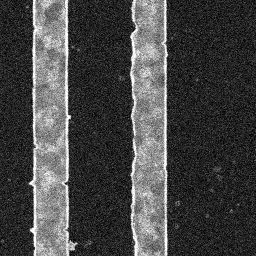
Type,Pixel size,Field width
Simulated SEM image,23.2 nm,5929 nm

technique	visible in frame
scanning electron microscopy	one or a few lines or trenches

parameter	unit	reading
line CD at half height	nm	750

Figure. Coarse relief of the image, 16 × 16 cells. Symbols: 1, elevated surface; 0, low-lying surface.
0011000011000000
0011000011000000
0011000011000000
0011000011000000
0011000011000000
0011000011000000
0011000011000000
0011000011000000
0011000011000000
0011000011000000
0011000011000000
0011000011000000
0011000011000000
0011000011000000
0011000011000000
0011000001000000